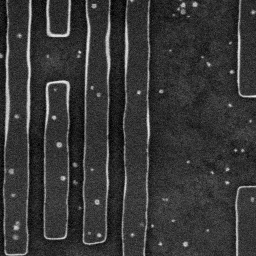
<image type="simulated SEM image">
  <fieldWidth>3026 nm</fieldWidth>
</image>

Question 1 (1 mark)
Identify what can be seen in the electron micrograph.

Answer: groups of lines, slits or small figures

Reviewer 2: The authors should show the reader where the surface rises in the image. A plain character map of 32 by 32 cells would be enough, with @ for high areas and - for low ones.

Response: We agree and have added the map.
-@@@--@@@--@@@--@@@-----------@@
-@@@--@@@--@@@--@@@-----------@@
-@@@--@@@--@@@--@@@-----------@@
-@@@--@@@--@@@--@@@-----------@@
-@@@-------@@---@@@-----------@@
-@@@-------@@---@@@-----------@@
-@@@-------@@---@@@-----------@@
-@@@-------@@@--@@@-----------@@
-@@@-------@@@--@@@-----------@@
-@@@-------@@@--@@@-----------@@
-@@@--@@---@@---@@@-----------@@
-@@@--@@---@@@--@@------------@@
-@@@--@@---@@@--@@--------------
-@@@--@@---@@@--@@--------------
-@@@--@@@--@@---@@--------------
-@@@--@@@--@@---@@@-------------
-@@---@@---@@---@@@-------------
-@@@--@@---@@---@@@-------------
-@@@--@@---@@---@@--------------
-@@@--@@---@@---@@--------------
-@@@--@@--@@@---@@--------------
-@@@--@@---@@---@@--------------
-@@@--@@--@@@---@@--------------
-@@@--@@--@@@---@@------------@@
-@@@--@@--@@@---@@------------@@
-@@---@@---@@--@@@------------@@
-@@--@@@---@@--@@@------------@@
-@@---@@--@@@--@@@------------@@
-@@---@@--@@@--@@@------------@@
-@@---@@--@@@--@@@------------@@
-@@------------@@@------------@@
-@@------------@@@------------@@